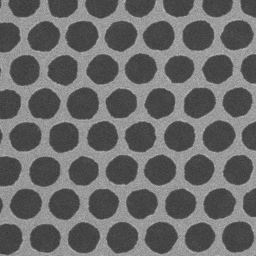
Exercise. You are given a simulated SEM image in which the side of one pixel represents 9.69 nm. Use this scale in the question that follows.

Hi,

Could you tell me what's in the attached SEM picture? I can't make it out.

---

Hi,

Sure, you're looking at a regular array of holes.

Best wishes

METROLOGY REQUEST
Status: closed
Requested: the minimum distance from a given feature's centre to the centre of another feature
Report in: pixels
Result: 38.1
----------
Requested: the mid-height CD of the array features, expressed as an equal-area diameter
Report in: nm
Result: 303